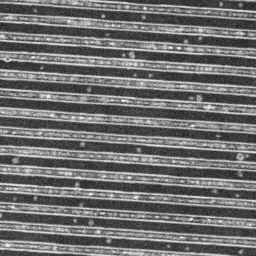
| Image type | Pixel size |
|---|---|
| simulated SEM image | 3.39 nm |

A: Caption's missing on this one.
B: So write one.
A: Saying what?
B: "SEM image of parallel lines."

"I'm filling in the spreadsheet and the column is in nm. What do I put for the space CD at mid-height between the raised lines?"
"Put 24.5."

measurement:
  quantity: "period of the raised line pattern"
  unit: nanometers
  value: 64.1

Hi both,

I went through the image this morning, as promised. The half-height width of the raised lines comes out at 39.8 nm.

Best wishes